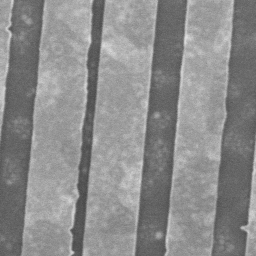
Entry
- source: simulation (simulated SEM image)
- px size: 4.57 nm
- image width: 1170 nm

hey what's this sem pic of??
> one or a few lines or trenches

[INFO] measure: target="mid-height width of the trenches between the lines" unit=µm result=0.142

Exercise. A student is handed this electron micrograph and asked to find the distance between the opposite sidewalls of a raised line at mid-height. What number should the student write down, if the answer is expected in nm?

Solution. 223